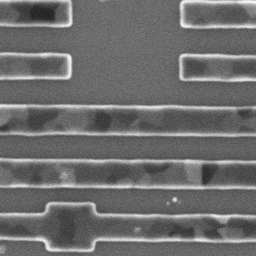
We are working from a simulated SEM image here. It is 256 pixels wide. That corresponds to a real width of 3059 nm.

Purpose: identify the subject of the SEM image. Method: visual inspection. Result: wiring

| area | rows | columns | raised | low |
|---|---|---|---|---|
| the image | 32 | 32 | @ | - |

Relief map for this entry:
@@@@@@@@@--------------@@@@@@@@@
@@@@@@@@@--------------@@@@@@@@@
@@@@@@@@@--------------@@@@@@@@@
--------------------------------
--------------------------------
--------------------------------
--------------------------------
@@@@@@@@@-------------@@@@@@@@@@
@@@@@@@@@-------------@@@@@@@@@@
@@@@@@@@@-------------@@@@@@@@@@
--------------------------------
--------------------------------
--------------------------------
@@@@@@@@@@@@@@@@@@@@@@@@@@@@@@@@
@@@@@@@@@@@@@@@@@@@@@@@@@@@@@@@@
@@@@@@@@@@@@@@@@@@@@@@@@@@@@@@@@
@@@@@@@@@@@@@@@@@@@@@@@@@@@@@@@@
--------------------------------
--------------------------------
--------------------------------
@@@@@@@@@@@@@@@@@@@@@@@@@@@@@@@@
@@@@@@@@@@@@@@@@@@@@@@@@@@@@@@@@
@@@@@@@@@@@@@@@@@@@@@@@@@@@@@@@@
-------------------------------@
--------------------------------
------@@@@@@--------------------
-----@@@@@@@--------------------
@@@@@@@@@@@@@@@@@@@@@@@@@@@@@@@@
@@@@@@@@@@@@@@@@@@@@@@@@@@@@@@@@
@@@@@@@@@@@@@@@@@@@@@@@@@@@@@@@@
------@@@@@@--------------------
--------------------------------